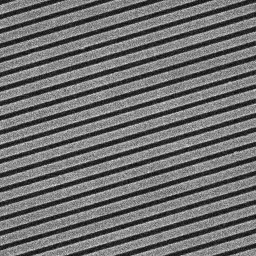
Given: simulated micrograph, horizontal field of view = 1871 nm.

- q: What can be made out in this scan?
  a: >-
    parallel lines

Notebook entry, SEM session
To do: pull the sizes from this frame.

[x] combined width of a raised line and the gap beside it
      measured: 101 nm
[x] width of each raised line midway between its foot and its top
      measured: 63.1 nanometers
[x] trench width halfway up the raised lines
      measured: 37.7 nanometres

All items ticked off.